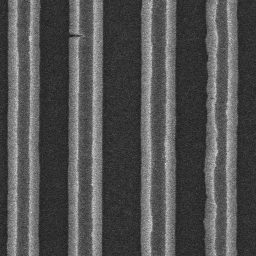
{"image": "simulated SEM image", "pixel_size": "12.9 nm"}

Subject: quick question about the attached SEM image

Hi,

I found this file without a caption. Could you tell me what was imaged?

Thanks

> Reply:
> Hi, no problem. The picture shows one or a few lines or trenches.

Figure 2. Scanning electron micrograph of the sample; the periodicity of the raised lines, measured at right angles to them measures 0.849 um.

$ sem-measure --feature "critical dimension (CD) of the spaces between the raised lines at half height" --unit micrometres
0.513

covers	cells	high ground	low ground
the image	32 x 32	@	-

--@@-----@@@------@@@------@@---
--@@-----@@@------@@@-----@@@---
--@@-----@@@------@@@-----@@@---
--@@-----@@@------@@@------@@---
--@@-----@@@------@@@------@@---
--@@-----@@@------@@@-----@@@---
--@@-----@@@------@@@------@@---
--@@-----@@@------@@@------@@---
--@@-----@@@------@@@-----@@@---
--@@-----@@@------@@@------@@---
--@@-----@@@------@@@------@@---
--@@-----@@@------@@@-----@@@---
--@@-----@@@------@@@-----@@@---
--@@-----@@@------@@@-----@@@---
--@@-----@@@------@@@-----@@@---
--@@-----@@@------@@@-----@@@---
--@@-----@@@------@@@-----@@@---
--@@-----@@@------@@@-----@@@---
--@@-----@@@------@@@-----@@@---
--@@-----@@@------@@@-----@@@---
--@@-----@@@------@@@-----@@@---
--@@-----@@@------@@@-----@@@---
--@@-----@@@------@@@-----@@@---
--@@-----@@@------@@@-----@@@---
--@@-----@@@------@@@-----@@@---
--@@-----@@@------@@@-----@@@---
--@@-----@@@------@@@-----@@@---
--@@-----@@@------@@@-----@@@---
--@@-----@@@------@@@-----@@@---
--@@-----@@@------@@@-----@@@---
--@@-----@@@------@@@-----@@@---
--@@-----@@@------@@@-----@@@---